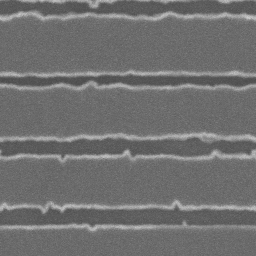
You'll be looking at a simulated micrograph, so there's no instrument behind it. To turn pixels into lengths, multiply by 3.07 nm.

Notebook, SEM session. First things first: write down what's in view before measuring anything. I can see one or a few lines or trenches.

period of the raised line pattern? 0.21 um